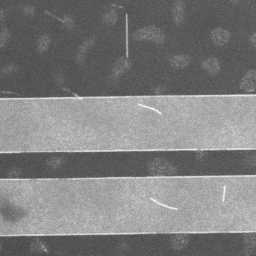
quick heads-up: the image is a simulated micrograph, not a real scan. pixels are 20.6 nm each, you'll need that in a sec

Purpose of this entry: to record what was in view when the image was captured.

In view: one or a few lines or trenches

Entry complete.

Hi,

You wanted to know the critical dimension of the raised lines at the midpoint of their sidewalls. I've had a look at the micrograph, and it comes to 1130 nm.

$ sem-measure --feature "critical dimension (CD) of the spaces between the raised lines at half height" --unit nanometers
559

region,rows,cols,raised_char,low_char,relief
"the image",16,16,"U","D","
DDDDDDDDDDDDDDDD
DDDDDDDDDDDDDDDD
DDDDDDDDDDDDDDDD
DDDDDDDDDDDDDDDD
DDDDDDDDDDDDDDDD
DDDDDDDDDDDDDDDD
UUUUUUUUUUUUUUUU
UUUUUUUUUUUUUUUU
UUUUUUUUUUUUUUUU
UUDDDDDDDDDDDDDD
DDDDDDDDDDDDDDDD
UUUUUUUUUUUUUUUU
UUUUUUUUUUUUUUUU
UUUUUUUUUUUUUUUU
UUUUUUUUUUUUUDDD
DDDDDDDDDDDDDDDD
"